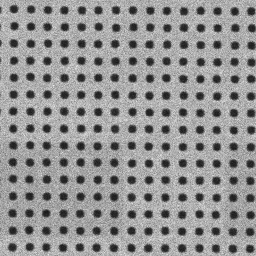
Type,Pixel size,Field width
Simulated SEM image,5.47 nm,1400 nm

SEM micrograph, a regular array of holes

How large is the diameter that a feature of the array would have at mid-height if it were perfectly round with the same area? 45.3 nm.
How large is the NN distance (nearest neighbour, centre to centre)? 0.0901 µm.